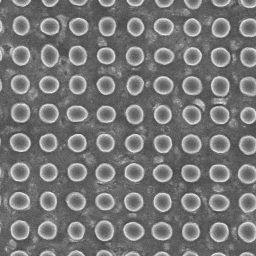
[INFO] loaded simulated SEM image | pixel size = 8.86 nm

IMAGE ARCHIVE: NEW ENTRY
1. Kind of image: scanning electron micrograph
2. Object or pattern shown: a regular array of raised bodies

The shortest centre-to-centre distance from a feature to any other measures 250 nanometres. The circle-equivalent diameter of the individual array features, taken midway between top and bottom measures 17.9 px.